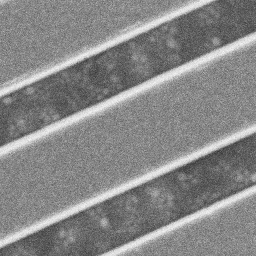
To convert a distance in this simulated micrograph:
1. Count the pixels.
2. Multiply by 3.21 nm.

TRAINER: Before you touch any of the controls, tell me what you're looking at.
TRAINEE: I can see one or a few lines or trenches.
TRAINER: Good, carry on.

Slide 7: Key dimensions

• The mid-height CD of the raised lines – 0.277 µm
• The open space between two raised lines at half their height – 0.164 µm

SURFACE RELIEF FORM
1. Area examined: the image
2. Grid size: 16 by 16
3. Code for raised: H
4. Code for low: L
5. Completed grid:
HHHHHHHHHHHHLLLL
HHHHHHHHHHLLLLLL
HHHHHHHHLLLLLLLH
HHHHHLLLLLLLLHHH
HHHLLLLLLLLHHHHH
HLLLLLLLLHHHHHHH
LLLLLLLHHHHHHHHH
LLLLHHHHHHHHHHHH
LLHHHHHHHHHHHHHL
HHHHHHHHHHHHHLLL
HHHHHHHHHHHLLLLL
HHHHHHHHLLLLLLLL
HHHHHHLLLLLLLLHH
HHHHLLLLLLLLHHHH
HHLLLLLLLLHHHHHH
LLLLLLLLHHHHHHHH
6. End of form